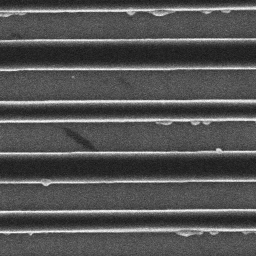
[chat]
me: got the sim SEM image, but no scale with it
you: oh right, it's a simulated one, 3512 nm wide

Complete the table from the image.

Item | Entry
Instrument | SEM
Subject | lines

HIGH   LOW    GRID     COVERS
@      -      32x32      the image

@@@@@@@@@@@@@@@@@@@@@@@@@@@@@@@@
@------------------@@-----------
--------------------------------
--------------------------------
--------------------------------
@@@@@@@@@@@@@@@@@@@@@@@@@@@@@@@@
@@@@@@@@@@@@@@@@@@@@@@@@@@@@@@@@
@@@@@@@@@@@@@@@@@@@@@@@@@@@@@@@@
@@@@@@@@@@@@@@@@@@@@@@@@@@@@@@@@
--------------------------------
--------------------------------
--------------------------------
--------------------------------
@@@@@@@@@@@@@@@@@@@@@@@@@@@@@@@@
@@@@@@@@@@@@@@@@@@@@@@@@@@@@@@@@
--------------------------------
--------------------------------
--------------------------------
--------------------------------
@@@@@@@@@@@@@@@@@@@@@@@@@@@@@@@@
@@@@@@@@@@@@@@@@@@@@@@@@@@@@@@@@
@@@@@@@@@@@@@@@@@@@@@@@@@@@@@@@@
@@@@@@@@@@@@@@@@@@@@@@@@@@@@@@@@
--------------------------------
--------------------------------
--------------------------------
@@@@@@@@@@@@@@@@@@@@@@@@@@@@@@@@
@@@@@@@@@@@@@@@@@@@@@@@@@@@@@@@@
@@@@@@@@@@@@@@@@@@@@@@@@@@@@@@@@
--------------------------------
--------------------------------
--------------------------------